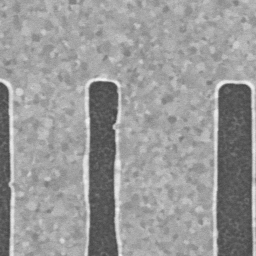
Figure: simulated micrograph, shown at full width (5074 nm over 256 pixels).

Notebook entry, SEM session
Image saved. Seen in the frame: one or a few lines or trenches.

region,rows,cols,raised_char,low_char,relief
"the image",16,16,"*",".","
****************
****************
****************
****************
****************
.****..*******..
.****..******...
.****..******...
.****..******...
.****..******...
.****..******...
.****..******...
.****..******...
.****..******...
.****..******...
.****..******...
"